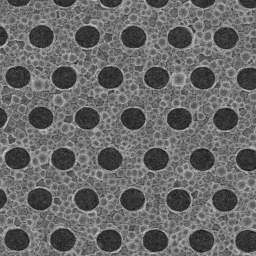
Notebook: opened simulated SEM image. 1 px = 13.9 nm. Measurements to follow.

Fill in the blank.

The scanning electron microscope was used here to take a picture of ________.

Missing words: a regular array of holes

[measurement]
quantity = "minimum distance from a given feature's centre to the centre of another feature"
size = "522 nanometres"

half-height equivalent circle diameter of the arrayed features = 334 nm